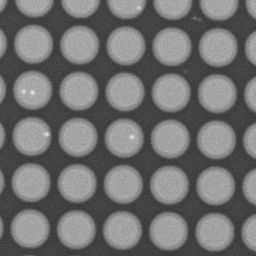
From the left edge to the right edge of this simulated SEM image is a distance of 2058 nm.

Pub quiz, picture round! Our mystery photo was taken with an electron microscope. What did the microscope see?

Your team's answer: an array of small figures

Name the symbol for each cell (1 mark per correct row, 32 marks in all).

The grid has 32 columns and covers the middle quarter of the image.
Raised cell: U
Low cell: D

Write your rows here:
DDDDDDDDDDDDDDDDDDDDDDDDDDDDDDDD
DDDDDDDDDDDDDDDDDDDDDDDDDDDDDDDD
DDUUUUDDDDDDDDUUUDDDDDDDDDUUDDDD
UUUUUUUDDDDDUUUUUUUDDDDDUUUUUUDD
UUUUUUUUDDDUUUUUUUUDDDDUUUUUUUUD
UUUUUUUUDDDUUUUUUUUUDDUUUUUUUUUD
UUUUUUUUDDDUUUUUUUUUDDUUUUUUUUUD
UUUUUUUUDDDUUUUUUUUUDDUUUUUUUUUU
UUUUUUUUDDDUUUUUUUUUDDUUUUUUUUUD
UUUUUUUUDDDUUUUUUUUDDDDUUUUUUUUD
DUUUUUUDDDDDUUUUUUUDDDDUUUUUUUDD
DDDUUDDDDDDDDDUUUDDDDDDDDUUUUDDD
DDDDDDDDDDDDDDDDDDDDDDDDDDDDDDDD
DDDDDDDDDDDDDDDDDDDDDDDDDDDDDDDD
DUUUUUDDDDDDUUUUUUDDDDDDUUUUUDDD
UUUUUUUDDDDUUUUUUUUDDDDUUUUUUUDD
UUUUUUUUDDDUUUUUUUUDDDUUUUUUUUUD
UUUUUUUUDDUUUUUUUUUUDDUUUUUUUUUD
UUUUUUUUDDUUUUUUUUUUDDUUUUUUUUUD
UUUUUUUUDDUUUUUUUUUUDDUUUUUUUUUD
UUUUUUUUDDDUUUUUUUUDDDUUUUUUUUUD
UUUUUUUDDDDUUUUUUUUDDDDUUUUUUUUD
DUUUUUDDDDDDUUUUUUDDDDDDUUUUUUDD
DDDDDDDDDDDDDDDDDDDDDDDDDDUUDDDD
DDDDDDDDDDDDDDDDDDDDDDDDDDDDDDDD
DUUUUDDDDDDDDUUUDDDDDDDDDDDDDDDD
UUUUUUUDDDDDUUUUUUDDDDDUUUUUUDDD
UUUUUUUDDDDUUUUUUUUDDDUUUUUUUUDD
UUUUUUUUDDUUUUUUUUUDDDUUUUUUUUUD
UUUUUUUUDDUUUUUUUUUUDDUUUUUUUUUD
UUUUUUUUDDUUUUUUUUUUDDUUUUUUUUUD
UUUUUUUUDDUUUUUUUUUDDDUUUUUUUUUD